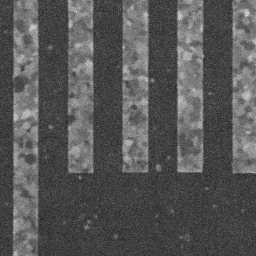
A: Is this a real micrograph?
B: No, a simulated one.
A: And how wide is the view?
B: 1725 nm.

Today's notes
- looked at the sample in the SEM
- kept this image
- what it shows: parallel lines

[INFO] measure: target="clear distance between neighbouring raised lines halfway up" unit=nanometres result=206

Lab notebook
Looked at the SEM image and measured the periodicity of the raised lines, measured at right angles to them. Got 369 nm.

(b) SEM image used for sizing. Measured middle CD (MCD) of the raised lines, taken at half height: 163 nm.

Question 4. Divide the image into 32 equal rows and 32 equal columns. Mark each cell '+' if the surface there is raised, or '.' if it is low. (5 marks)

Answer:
..+++....++....+++....+++....+++
..+++....++....+++....+++....+++
..+++....++....+++....+++....+++
..+++....++....+++....+++....+++
..+++....++....+++....+++....+++
..+++....++....+++....+++....+++
..+++....++....+++....+++....+++
..+++....++....+++....+++....+++
..+++....+++...+++....+++....+++
..+++....+++...+++....+++....+++
..+++....+++...+++....+++....+++
..+++....+++...+++....+++....+++
..+++....+++...+++....+++....+++
..+++....+++...+++....+++....+++
..+++....+++...+++....+++....+++
..+++....+++...+++....+++....+++
..+++....+++...+++....+++....+++
..+++....+++...+++....+++....+++
..+++....+++...+++....+++....+++
..+++....+++..++++....+++....+++
..+++....+++...+++....+++....+++
..+++........................++.
..+++...........................
..+++...........................
..+++...........................
..+++...........................
..+++...........................
..+++...........................
..+++...........................
..+++...........................
..+++...........................
..+++...........................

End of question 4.